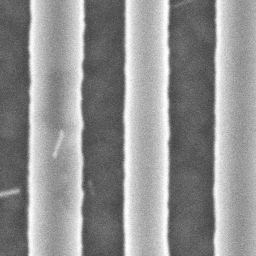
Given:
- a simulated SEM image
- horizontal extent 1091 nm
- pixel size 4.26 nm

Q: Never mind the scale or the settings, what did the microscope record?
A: lines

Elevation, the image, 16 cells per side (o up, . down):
..ooo...oo....oo
..ooo...oo....oo
..ooo...oo....oo
..ooo...ooo...oo
..ooo...ooo...oo
..ooo...oo....oo
..ooo...oo...ooo
..ooo...oo....oo
..ooo...ooo..ooo
..ooo...oo...ooo
..ooo...oo...ooo
..ooo...oo...ooo
..ooo...oo...ooo
..ooo...oo...ooo
..ooo...oo...ooo
..ooo...oo...ooo